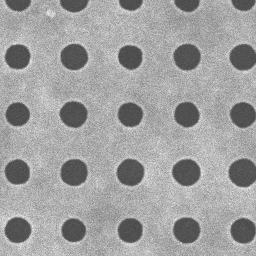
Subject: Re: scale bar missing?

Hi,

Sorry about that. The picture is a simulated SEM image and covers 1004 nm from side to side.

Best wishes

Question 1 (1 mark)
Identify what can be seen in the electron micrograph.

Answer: a regular array of holes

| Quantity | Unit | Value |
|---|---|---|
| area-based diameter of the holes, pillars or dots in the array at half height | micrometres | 0.102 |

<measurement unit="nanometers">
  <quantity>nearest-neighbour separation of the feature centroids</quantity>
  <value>221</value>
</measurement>